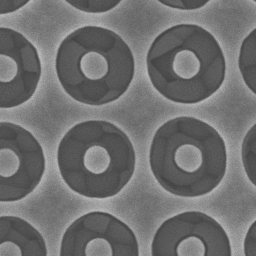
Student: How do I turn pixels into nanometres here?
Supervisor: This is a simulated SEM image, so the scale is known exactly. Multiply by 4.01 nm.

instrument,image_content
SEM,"ring-shaped grooves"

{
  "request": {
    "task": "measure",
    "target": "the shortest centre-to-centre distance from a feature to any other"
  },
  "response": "366 nanometers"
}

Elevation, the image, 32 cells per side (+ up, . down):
...++++++......+++++......++++++
.++++++++++..+++++++++++++++++++
++++++++++++++++++++++++++++++++
++++++++++...++++++++....+++++++
...+++++.......+++++.......++++.
....++++........+++........+++..
.....++.........++....++....++..
++...++...+++....+....+++...++..
++...++...+++....+....+++...++..
++...++....++....++...++....++..
.....+++........+++.........+++.
....++++........++++.......+++++
...+++++++....+++++++....+++++++
++++++++++++++++++++++++++++++++
++++++++++++++++++++++++++++++++
..++++++++....+++++++.....++++++
....+++++......+++++.......++++.
.....+++........+++.........++..
.....++....++....++...+++...++..
++...++....+++...++...+++...++..
++....+....+++...++...+++...++..
++...+++...++....++.........+++.
.....+++........++++........+++.
....+++++......+++++.......+++++
...++++++++...+++++++++..+++++++
++++++++++++++++++++++++++++++++
++++++++++++.++++++++++..+++++++
...+++++++.....++++++......+++++
....++++........++++........+++.
.....+++.........++.........+++.
++....++...+++...++....++....++.
+++...++...+++...++...++++...++.